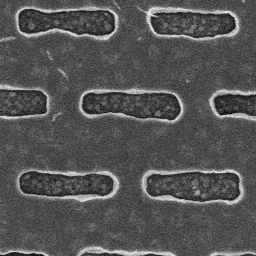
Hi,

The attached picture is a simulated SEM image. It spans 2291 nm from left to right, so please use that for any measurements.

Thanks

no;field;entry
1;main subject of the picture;holes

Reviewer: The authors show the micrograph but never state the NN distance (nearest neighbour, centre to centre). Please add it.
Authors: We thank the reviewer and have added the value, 0.911 um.